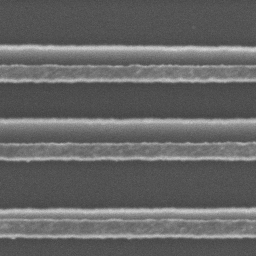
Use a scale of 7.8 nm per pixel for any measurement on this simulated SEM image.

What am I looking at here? lines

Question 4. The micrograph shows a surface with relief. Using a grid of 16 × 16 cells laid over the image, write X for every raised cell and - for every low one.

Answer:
----------------
----------------
----------------
XXXXXXXXXXXXXXXX
XXXXXXXXXXXXXXXX
----------------
----------------
----------------
XXXXXXXXXXXXXXXX
XXXXXXXXXXXXXXXX
----------------
----------------
----------------
XXXXXXXXXXXXXXXX
XXXXXXXXXXXXXXXX
----------------